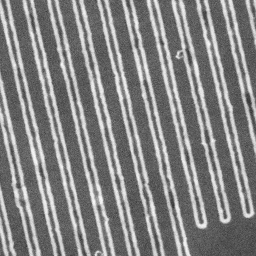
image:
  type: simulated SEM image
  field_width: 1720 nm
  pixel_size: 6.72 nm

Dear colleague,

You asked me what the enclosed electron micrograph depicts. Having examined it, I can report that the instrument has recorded parallel lines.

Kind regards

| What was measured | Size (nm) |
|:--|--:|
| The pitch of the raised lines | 163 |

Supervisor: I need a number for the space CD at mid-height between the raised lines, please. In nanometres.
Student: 109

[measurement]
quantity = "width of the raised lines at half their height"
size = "51.7 nanometers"